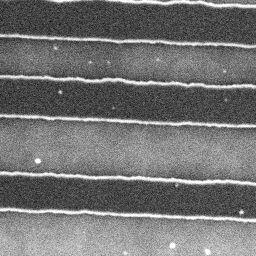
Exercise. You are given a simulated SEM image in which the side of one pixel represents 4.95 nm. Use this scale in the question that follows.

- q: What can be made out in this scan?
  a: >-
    lines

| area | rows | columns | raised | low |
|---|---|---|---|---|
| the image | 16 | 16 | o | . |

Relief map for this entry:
oooooooooooooooo
oooooooooooooooo
......oooooooooo
................
................
oooooooooooooooo
oooooooooooooooo
....oooooooooooo
................
................
................
oooooooooooooooo
oooooooooooooooo
.........ooooooo
................
................